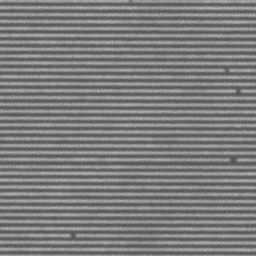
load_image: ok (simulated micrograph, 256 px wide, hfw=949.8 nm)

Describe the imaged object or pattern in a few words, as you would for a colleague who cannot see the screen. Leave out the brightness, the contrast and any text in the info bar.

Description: parallel lines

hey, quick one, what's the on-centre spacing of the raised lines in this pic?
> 6.9 pixels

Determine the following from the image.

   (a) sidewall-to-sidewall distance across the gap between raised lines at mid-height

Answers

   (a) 13.4 nm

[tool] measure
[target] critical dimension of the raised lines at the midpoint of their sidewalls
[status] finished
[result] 0.0102 µm